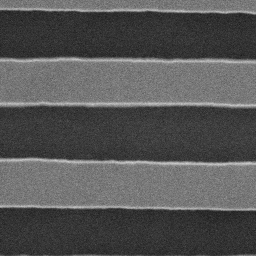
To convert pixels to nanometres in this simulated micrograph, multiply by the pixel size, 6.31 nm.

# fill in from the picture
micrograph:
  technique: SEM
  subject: lines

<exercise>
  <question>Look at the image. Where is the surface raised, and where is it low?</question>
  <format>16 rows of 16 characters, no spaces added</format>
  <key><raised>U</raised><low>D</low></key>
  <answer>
UUUUUUUUUUUUUUUU
DDDDDDDDDDDDDDDD
DDDDDDDDDDDDDDDD
DDDDDDDDDDDDDDDD
UUUUUUUUUUUUUUUU
UUUUUUUUUUUUUUUU
DUDDDUDDDDDDUUUU
DDDDDDDDDDDDDDDD
DDDDDDDDDDDDDDDD
DDDDDDDDDDDDDDDD
UUUUUUUUUUUUUUUU
UUUUUUUUUUUUUUUU
UUUUUUUUUUUUUUUU
DDDDDDDDDDDDDDDD
DDDDDDDDDDDDDDDD
DDDDDDDDDDDDDDDD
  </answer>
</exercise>